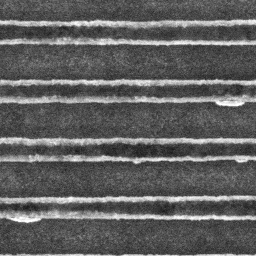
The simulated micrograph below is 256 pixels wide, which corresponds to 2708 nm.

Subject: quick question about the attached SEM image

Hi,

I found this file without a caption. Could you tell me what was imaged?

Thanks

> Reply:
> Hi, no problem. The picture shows lines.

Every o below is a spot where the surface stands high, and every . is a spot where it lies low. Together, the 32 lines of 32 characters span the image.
................................
................................
................................
oooooooooooooooooooooooooooooooo
oooooooooooooooooooooooooooooooo
................................
................................
................................
................................
................................
oooooooooooooooooooooooooooooooo
oooooooooooooooooooooooooooooooo
oooooooooooooooooooooooooo......
................................
................................
................................
................................
ooo...........oo.o....oo..ooooo.
oooooooooooooooooooooooooooooooo
oooooooooooooooooooooooooooooooo
................................
................................
................................
................................
................................
oooooooooooooooooooooooooooooooo
oooooooooooooooooooooooooooooooo
................................
................................
................................
................................
................................